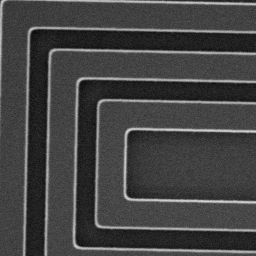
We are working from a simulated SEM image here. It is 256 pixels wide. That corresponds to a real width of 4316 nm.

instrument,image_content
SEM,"groups of lines, slits or small figures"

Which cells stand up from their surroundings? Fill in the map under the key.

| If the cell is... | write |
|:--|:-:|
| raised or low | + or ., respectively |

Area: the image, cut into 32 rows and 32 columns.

++++++++++++++++++++++++++++....
++++++++++++++++++++++++++++++++
++++++++++++++++++++++++++++++++
+++++..+++++++++++++++++++++++++
++++............................
++++............................
+++....+++++++++++..............
+++...++++++++++++++++++++++++++
+++...++++++++++++++++++++++++++
+++...++++++++++++++++++++++++++
+++...++++......................
+++...++++......................
+++...++++......................
+++...++++..++++++++++++++++++++
+++...++++..++++++++++++++++++++
+++...++++..++++++++++++++++++++
+++...+++...++++................
+++...+++...++++................
+++...+++...++++................
+++...+++...++++................
+++...+++...++++................
+++...+++...++++................
+++...+++...++++................
+++...+++...++++................
+++...+++...++++................
+++...+++...++++++++++++++++++++
+++...+++...++++++++++++++++++++
+++...+++...++++++++++++++++++++
+++...+++.......++++++++++++++++
+++...+++.......................
+++...+++.......................
+++...++++++++++++++++++++++++++